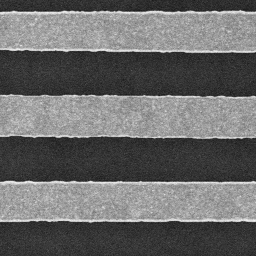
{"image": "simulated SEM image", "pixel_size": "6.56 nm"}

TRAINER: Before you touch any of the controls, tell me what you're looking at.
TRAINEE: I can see lines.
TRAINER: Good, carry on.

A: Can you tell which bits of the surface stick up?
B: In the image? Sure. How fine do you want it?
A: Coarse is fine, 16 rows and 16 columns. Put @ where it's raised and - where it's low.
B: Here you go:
----------------
@@@@@@@@@@@@@@@@
@@@@@@@@@@@@@@@@
----------------
----------------
----------------
@@@@@@@@@@@@@@@@
@@@@@@@@@@@@@@@@
@@@@@@@@@@@@@@@@
----------------
----------------
@@@@@@@@@@@@@@@@
@@@@@@@@@@@@@@@@
@@@@@@@@@@@@@@@@
----------------
----------------